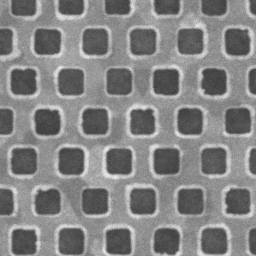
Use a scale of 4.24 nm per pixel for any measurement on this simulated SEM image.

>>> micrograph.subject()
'a regular array of holes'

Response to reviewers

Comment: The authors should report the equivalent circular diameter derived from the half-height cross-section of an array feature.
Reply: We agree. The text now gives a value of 126 nanometers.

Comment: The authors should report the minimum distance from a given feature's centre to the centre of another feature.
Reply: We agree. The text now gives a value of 195 nm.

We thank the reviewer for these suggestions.